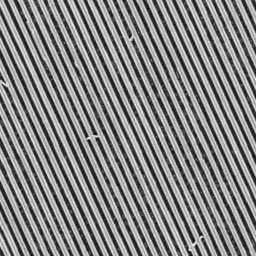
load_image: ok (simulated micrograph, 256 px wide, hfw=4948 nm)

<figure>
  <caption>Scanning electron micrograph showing parallel lines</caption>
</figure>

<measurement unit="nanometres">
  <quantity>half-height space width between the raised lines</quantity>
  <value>94.7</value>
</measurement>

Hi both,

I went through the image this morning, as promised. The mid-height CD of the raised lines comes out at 0.077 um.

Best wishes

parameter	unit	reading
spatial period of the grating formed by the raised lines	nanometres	174